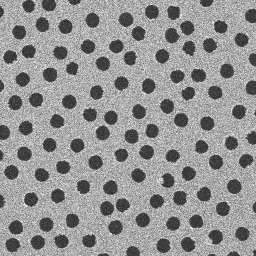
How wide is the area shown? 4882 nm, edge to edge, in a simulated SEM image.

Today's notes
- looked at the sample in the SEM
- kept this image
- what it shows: a regular array of holes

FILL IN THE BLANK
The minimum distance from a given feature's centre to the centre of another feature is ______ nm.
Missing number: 429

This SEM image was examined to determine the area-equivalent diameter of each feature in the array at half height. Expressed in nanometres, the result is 269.